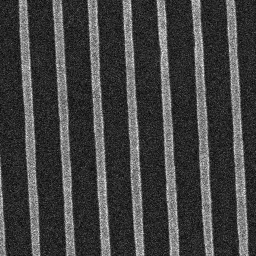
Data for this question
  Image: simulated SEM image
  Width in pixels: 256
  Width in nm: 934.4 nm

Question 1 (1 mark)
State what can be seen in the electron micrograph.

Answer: parallel lines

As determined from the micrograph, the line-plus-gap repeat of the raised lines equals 126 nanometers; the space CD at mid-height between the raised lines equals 98.9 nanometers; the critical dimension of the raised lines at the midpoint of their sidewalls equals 26.4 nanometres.